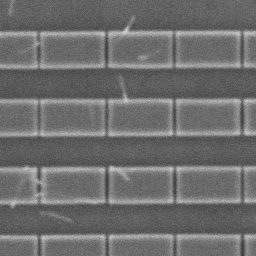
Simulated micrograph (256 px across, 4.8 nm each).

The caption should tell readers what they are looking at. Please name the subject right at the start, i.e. wiring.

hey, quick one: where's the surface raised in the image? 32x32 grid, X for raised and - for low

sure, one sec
--------------------------------
--------------------------------
--------------------------------
--------------------------------
XXXXXXXXXXXXXXXXXXXXXXXXXXXXXXXX
XXXXXXXXXXXXXXXXXXXXXXXXXXXXXXXX
XXXXXXXXXXXXXXXXXXXXXXXXXXXXXXXX
XXXXXXXXXXXXXXXXXXXXXXXXXXXXXXXX
--------------------------------
--------------------------------
--------------------------------
--------------------------------
---------------X----------------
XXXXXXXXXXXXXXXXXXXXXXXXXXXXXXXX
XXXXXXXXXXXXXXXXXXXXXXXXXXXXXXXX
XXXXXXXXXXXXXXXXXXXXXXXXXXXXXXXX
XXXXXXXXXXXXXXXXXXXXXXXXXXXXXXXX
--------------------------------
--------------------------------
--------------------------------
--------------------------------
XXXXXXXXXXXXX-XXXXXXXXXXXXXXXXXX
XXXXXXXXXXXXX-XXXXXXXXXXXXXXXXXX
XXXXXXXXXXXXX-XXXXXXXXXXXXXXXXXX
XXXXXXXXXXXXX-XXXXXXXXXXXXXXXXXX
-X------------------------------
--------------------------------
--------------------------------
--------------------------------
-----------XX-XXXXXXX-XXXXXXXX-X
XXXXXXXXXXXXX-XXXXXXXXXXXXXXXXXX
XXXXXXXXXXXXXXXXXXXXXXXXXXXXXXXX